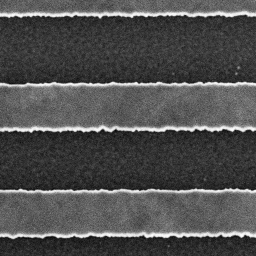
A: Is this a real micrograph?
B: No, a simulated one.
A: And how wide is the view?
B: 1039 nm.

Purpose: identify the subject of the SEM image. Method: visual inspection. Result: lines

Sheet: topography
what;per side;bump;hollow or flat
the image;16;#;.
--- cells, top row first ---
################
................
................
................
................
################
################
################
................
................
................
................
################
################
################
................